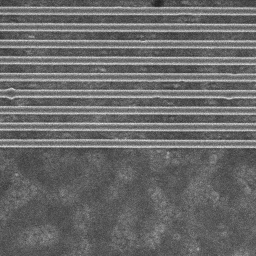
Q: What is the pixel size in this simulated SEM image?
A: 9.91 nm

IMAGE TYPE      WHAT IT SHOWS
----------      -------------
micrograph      parallel lines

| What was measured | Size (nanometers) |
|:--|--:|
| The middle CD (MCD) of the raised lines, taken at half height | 73.1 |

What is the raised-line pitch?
164 nm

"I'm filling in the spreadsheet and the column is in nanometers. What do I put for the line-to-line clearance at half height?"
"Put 91.7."